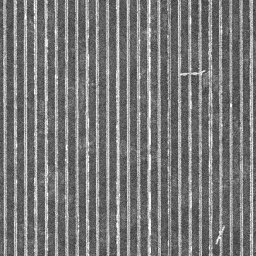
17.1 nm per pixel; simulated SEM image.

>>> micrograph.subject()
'parallel lines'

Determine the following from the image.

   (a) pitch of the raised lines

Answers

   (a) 175 nm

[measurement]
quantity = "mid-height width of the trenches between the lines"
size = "145 nanometres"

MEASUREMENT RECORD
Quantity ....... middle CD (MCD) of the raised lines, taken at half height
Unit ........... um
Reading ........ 0.0384